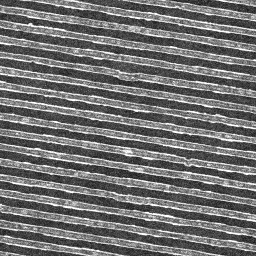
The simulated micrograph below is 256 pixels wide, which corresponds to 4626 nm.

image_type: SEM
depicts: parallel lines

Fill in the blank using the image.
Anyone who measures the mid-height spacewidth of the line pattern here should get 0.156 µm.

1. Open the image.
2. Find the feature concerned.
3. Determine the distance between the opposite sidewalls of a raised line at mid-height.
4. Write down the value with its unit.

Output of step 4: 112 nanometres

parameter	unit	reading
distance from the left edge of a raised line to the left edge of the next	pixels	15.2